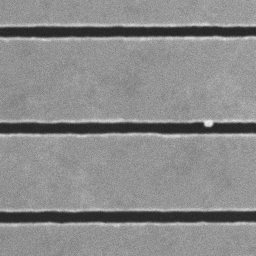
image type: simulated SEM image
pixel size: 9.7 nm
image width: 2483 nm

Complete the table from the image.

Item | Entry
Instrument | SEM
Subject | lines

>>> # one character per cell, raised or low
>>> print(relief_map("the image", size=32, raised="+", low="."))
++++++++++++++++++++++++++++++++
++++++++++++++++++++++++++++++++
++++++++++++++++++++++++++++++++
................................
................................
++++++++++++++++++++++++++++++++
++++++++++++++++++++++++++++++++
++++++++++++++++++++++++++++++++
++++++++++++++++++++++++++++++++
++++++++++++++++++++++++++++++++
++++++++++++++++++++++++++++++++
++++++++++++++++++++++++++++++++
++++++++++++++++++++++++++++++++
++++++++++++++++++++++++++++++++
++++++++++++++++++++++++++++++++
.........................++.....
................................
++++++++++++++++++++++++++++++++
++++++++++++++++++++++++++++++++
++++++++++++++++++++++++++++++++
++++++++++++++++++++++++++++++++
++++++++++++++++++++++++++++++++
++++++++++++++++++++++++++++++++
++++++++++++++++++++++++++++++++
++++++++++++++++++++++++++++++++
++++++++++++++++++++++++++++++++
................................
................................
++++++++++++++++++++++++++++++++
++++++++++++++++++++++++++++++++
++++++++++++++++++++++++++++++++
++++++++++++++++++++++++++++++++